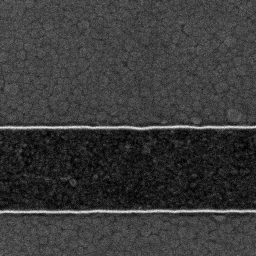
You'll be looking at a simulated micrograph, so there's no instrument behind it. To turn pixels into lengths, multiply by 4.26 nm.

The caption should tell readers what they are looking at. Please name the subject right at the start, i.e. one or a few lines or trenches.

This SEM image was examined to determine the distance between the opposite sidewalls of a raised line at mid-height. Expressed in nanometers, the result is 362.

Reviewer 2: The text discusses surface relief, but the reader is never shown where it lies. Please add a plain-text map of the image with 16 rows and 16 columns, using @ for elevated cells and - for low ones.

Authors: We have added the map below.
----------------
----------------
----------------
----------------
----------------
----------------
----------------
----------------
@@@@@@@@@@@@@@@@
@@@@@@@@@@@@@@@@
@@@@@@@@@@@@@@@@
@@@@@@@@@@@@@@@@
@@@@@@@@@@@@@@@@
----------------
----------------
----------------